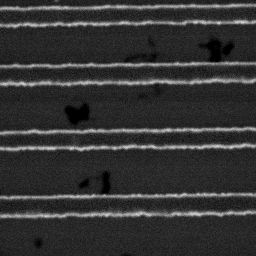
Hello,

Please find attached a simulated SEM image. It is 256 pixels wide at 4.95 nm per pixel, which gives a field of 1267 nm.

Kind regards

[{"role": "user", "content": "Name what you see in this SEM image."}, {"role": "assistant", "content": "lines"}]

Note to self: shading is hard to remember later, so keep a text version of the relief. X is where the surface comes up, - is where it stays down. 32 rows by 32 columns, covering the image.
--------------------------------
XXXXXXXXXXXXXXXXXXXXXXXXXXXXXXXX
XXXXXXXXXXXXXXXXXXXXXXXXXXXXXXXX
--------------------------------
--------------------------------
--------------------------------
--------------------------------
--------------------------------
XXXXXXXXXXXXXXXXXXXXXXXXXXXXXXXX
XXXXXXXXXXXXXXXXXXXXXXXXXXXXXXXX
XXXXXXXXXXX-X---X---------------
--------------------------------
--------------------------------
--------------------------------
--------------------------------
--------------------------------
XXXXXXXXXXXXXXXXXXXXXXXXXXXXXXXX
XXXXXXXXXXXXXXXXXXXXXXXXXXXXXXXX
XXXXXXXXXXXXXXXX-X-XXXXXX---X---
--------------------------------
--------------------------------
--------------------------------
--------------------------------
--------------------------------
------XXXXXXXXXXXXXXXXXXXXXXXXXX
XXXXXXXXXXXXXXXXXXXXXXXXXXXXXXXX
XXXXXXXXXXXXXXXXXXXXXXXXXXXXXXXX
--------------------------------
--------------------------------
--------------------------------
--------------------------------
--------------------------------